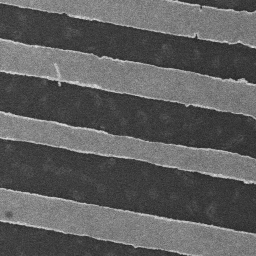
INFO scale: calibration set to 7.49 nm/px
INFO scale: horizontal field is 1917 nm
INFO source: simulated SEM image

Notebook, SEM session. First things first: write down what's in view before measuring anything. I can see one or a few lines or trenches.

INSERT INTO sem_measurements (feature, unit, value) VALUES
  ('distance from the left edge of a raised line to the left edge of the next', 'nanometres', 542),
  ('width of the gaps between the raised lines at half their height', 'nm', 310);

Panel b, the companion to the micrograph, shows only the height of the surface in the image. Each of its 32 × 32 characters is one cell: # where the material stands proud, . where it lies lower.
.#######################........
......#########################.
............####################
.................###############
.......................#########
###...........................##
##########......................
###############.................
####################............
....######################......
.........#######################
..............##################
.....................###########
..........................######
###............................#
########........................
#############...................
.#################..............
........################........
.............#################..
...................#############
.........................#######
..............................##
................................
#####...........................
###########.....................
################................
######################..........
.....#######################....
...........#####################
................################
......................##########